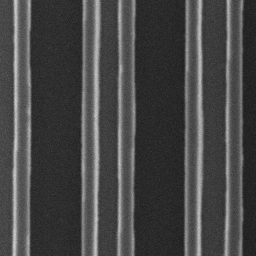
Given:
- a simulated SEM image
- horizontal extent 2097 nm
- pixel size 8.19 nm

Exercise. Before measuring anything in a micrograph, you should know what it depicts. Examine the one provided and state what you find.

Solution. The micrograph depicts lines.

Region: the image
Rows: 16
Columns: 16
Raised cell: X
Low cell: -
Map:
XX---XXX----XXX-
XX---XXX----XXX-
XX---XXX----XXX-
XX---XXX----XXX-
XX---XXX----XXX-
XX---XXX----XXX-
XX---XXX----XXX-
XX---XXX----XXX-
XX---XXX----XXX-
XX---XXX----XXX-
XX---XXX----XXX-
XX---XXX----XXX-
XX---XXX----XXX-
XX---XXX----XXX-
XX---XXX----XXX-
XX---XXX----XXX-